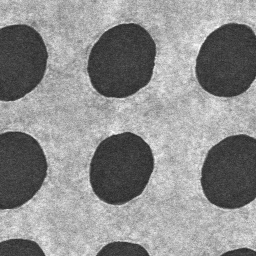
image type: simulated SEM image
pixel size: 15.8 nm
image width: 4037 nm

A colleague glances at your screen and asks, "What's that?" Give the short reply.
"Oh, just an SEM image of holes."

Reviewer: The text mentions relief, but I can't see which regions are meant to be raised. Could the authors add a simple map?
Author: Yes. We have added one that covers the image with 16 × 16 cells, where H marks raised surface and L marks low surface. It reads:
HHHHHHHHHHHHHHHH
HHHHHHHHHHHHHHHH
LLLHHHLLLLHHHLLL
LLLHHHLLLLHHLLLL
LLLHHHLLLLHHLLLL
LLHHHHLLLHHHHLLH
HHHHHHHHHHHHHHHH
HHHHHHHHHHHHHHHH
LLHHHHHLLHHHHHHH
LLLHHHLLLHHHHLLL
LLLHHHLLLLHHHLLL
LLLHHHLLLHHHHLLL
LLHHHHLLHHHHHLLL
HHHHHHHHHHHHHHHH
HHHHHHHHHHHHHHHH
LLLHHHLLLHHHHHHH